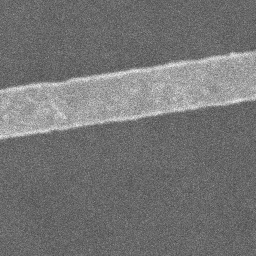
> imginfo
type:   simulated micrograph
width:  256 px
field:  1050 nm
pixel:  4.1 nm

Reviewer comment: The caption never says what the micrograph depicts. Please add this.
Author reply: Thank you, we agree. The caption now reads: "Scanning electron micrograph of one or a few lines or trenches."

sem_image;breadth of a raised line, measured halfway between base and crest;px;45.9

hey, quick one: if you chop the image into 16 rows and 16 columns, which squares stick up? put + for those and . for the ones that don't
................
................
................
..............++
........++++++++
.+++++++++++++++
++++++++++++++..
+++++++.........
+...............
................
................
................
................
................
................
................